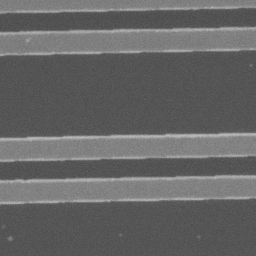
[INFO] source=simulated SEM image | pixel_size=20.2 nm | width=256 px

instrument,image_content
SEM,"lines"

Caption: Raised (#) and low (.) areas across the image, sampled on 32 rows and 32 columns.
################################
#######.........................
................................
..............................##
################################
################################
##################..............
................................
................................
................................
................................
................................
................................
................................
................................
................................
................................
################################
################################
###############################.
................................
................................
......##########################
################################
################################
................................
................................
................................
................................
................................
................................
................................